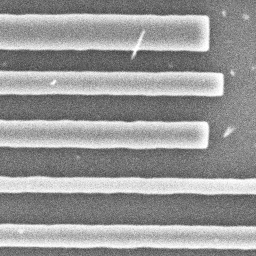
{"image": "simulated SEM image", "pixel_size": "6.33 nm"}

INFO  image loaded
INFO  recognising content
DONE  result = groups of lines, slits or small figures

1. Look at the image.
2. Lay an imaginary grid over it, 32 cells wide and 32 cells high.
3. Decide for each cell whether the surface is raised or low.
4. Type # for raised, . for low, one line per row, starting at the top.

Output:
................................
................................
##########################......
##########################......
##########################......
##########################......
................................
................................
................................
############################....
############################....
############################....
................................
................................
................................
##########################......
##########################......
##########################......
.................#..............
................................
................................
................................
##########################.###.#
################################
................................
................................
................................
................................
################################
################################
################################
................................